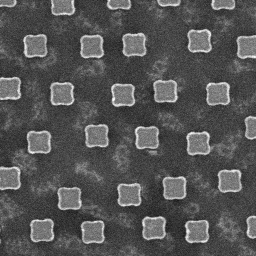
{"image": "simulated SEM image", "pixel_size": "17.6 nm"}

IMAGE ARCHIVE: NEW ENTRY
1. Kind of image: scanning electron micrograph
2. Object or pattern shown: a regular array of raised bodies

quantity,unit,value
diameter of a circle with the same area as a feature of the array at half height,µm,0.424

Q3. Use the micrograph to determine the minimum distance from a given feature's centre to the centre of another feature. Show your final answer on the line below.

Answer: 774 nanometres